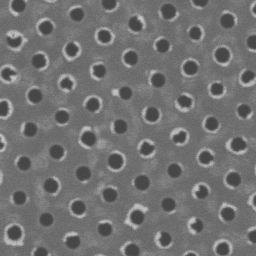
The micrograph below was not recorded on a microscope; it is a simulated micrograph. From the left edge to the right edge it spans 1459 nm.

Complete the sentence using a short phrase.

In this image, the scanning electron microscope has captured a regular array of holes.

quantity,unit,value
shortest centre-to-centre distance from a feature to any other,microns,0.193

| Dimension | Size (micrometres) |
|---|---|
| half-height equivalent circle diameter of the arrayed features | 0.0787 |